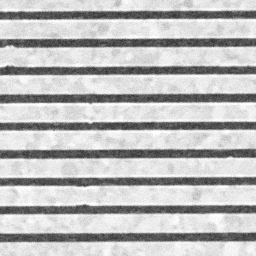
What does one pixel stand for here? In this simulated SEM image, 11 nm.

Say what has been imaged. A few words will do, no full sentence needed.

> parallel lines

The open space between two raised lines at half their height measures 0.115 um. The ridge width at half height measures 193 nanometers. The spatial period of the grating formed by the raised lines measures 304 nanometers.